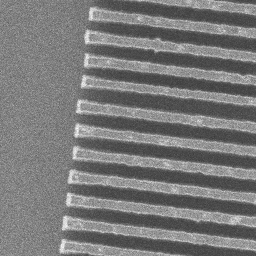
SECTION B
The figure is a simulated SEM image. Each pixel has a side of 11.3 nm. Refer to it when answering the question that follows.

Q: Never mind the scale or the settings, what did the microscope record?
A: parallel lines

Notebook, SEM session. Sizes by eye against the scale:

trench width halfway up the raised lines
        136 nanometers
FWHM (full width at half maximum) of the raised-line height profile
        0.124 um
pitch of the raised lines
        263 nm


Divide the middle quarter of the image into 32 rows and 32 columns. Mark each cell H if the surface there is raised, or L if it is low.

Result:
LLLLLLHHHHHHHHHHHHHHHHHHHHHHLLLL
LLLLLLLLLLLLLLLHHHHHHHHHHHHHHHHH
LLLLLLLLLLLLLLLLLLLLLLLHHHHHHHHH
LLLLLHHLLLLLLLLLLLLLLLLLLLLLLLLL
LLLLLHHHHHHHHHHLLLLLLLLLLLLLLLLL
LLLLLHHHHHHHHHHHHHHHHHHHLLLLLLLL
LLLLLLLLLLLLHHHHHHHHHHHHHHHHHHHH
LLLLLLLLLLLLLLLLLLLLLLHHHHHHHHHH
LLLLLLLLLLLLLLLLLLLLLLLLLLLLLHHH
LLLLHHLLLLLLLLLLLLLLLLLLLLLLLLLL
LLLLHHHHHHHHHHLLLLLLLLLLLLLLLLLL
LLLLHHHHHHHHHHHHHHHHHHLLLLLLLLLL
LLLLLLLLHHHHHHHHHHHHHHHHHHHHHHLL
LLLLLLLLLLLLLLLLLHHHHHHHHHHHHHHH
LLLLLLLLLLLLLLLLLLLLLLLHLHHHHHHH
LLLHHLLLLLLLLLLLLLLLLLLLLLLLLLLL
LLLHHHHHHHHHHLLLLLLLLLLLLLLLLLLL
LLLHHHHHHHHHHHHHHHHHHHHLLLLLLLLL
LLLLLLLLLHHHHHHHHHHHHHHHHHHHHHLL
LLLLLLLLLLLLLLLLLHHHHHHHHHHHHHHH
LLLLLLLLLLLLLLLLLLLLLLLLLHHHHHHH
LLLHHHLLLLLLLLLLLLLLLLLLLLLLLLLL
LLLHHHHHHHHHHHHLLLLLLLLLLLLLLLLL
LLLHHHHHHHHHHHHHHHHHHHHLLLLLLLLL
LLLLLLLLLLHHHHHHHHHHHHHHHHHHHHHH
LLLLLLLLLLLLLLLLHHHHHHHHHHHHHHHH
LLLLLLLLLLLLLLLLLLLLLLLLLLHHHHHH
LLHHHHLLLLLLLLLLLLLLLLLLLLLLLLLL
LLHHHHHHHHHHHHHLLLLLLLLLLLLLLLLL
LLHHHHHHHHHHHHHHHHHHHHHHHLLLLLLL
LLLLLLLLLLHHHHHHHHHHHHHHHHHHHHHH
LLLLLLLLLLLLLLLLLLLHHHHHHHHHHHHH